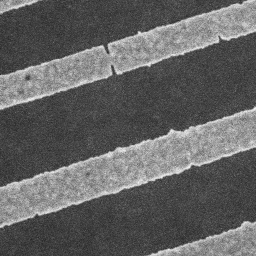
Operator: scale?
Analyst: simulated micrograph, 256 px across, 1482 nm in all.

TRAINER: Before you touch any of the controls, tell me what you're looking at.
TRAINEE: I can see one or a few lines or trenches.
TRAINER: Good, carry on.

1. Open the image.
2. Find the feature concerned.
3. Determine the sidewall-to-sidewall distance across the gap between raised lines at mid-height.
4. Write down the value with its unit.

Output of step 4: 422 nm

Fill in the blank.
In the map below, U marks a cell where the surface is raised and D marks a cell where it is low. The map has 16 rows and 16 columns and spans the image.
UDDDDDDDDDDDDDUU
DDDDDDDDDDDUUUUU
DDDDDDDUUUUUUUDD
DDDDUUUUUUUDDDDD
DUUUUUUDDDDDDDDD
UUUUUDDDDDDDDDDD
UDDDDDDDDDDDDDDD
DDDDDDDDDDDDDDUU
DDDDDDDDDDUUUUUU
DDDDDDDUUUUUUUUD
DDDDUUUUUUUUDDDD
DUUUUUUUUDDDDDDD
UUUUUUDDDDDDDDDD
UUDDDDDDDDDDDDDD
DDDDDDDDDDDDDDUU
DDDDDDDDDDDUUUUU